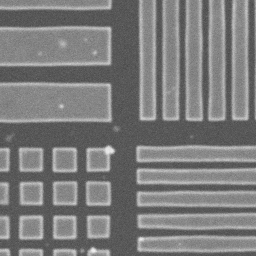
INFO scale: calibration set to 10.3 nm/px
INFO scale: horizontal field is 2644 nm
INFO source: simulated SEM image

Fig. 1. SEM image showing groups of lines, slits or small figures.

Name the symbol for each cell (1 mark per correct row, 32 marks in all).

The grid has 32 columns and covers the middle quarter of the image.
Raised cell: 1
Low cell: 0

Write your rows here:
00000000000000000001111001111001
00000000000000000001111001111001
00000000000000000001111001111001
00000000000000000001111001111001
00000000000000000001111001111001
11111111111000000001111001111001
11111111111000000001111001111001
11111111111100000001111001111001
11111111111100000001111001111001
11111111111100000001111001111001
11111111111100000001111001111001
11111111111100000001111001111001
11111111111100000001111001111001
11111111111100000001111001111001
00000000000000000000000000000000
00000000000000000000000000000000
00000000000000000000000000000000
00000000000000000000000000000000
00000000000000000000000000000000
00000000000000000000000000000000
00000000000000000000000000000000
11100011111110000011111111111111
11100011111000000011111111111111
11100011111000000011111111111111
11100011111000000000000000000000
11100011111000000000000000000000
11100011111000000001110000000000
00000000000000000011111111111111
00000000000000000011111111111111
00000000000000000011111111111111
11100011111000000000000000000000
11100011111000000000000000000000